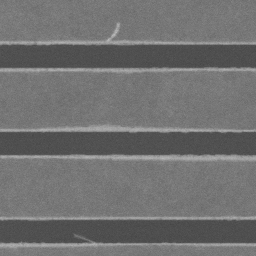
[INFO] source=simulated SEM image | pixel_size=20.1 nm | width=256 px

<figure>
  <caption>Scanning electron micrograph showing lines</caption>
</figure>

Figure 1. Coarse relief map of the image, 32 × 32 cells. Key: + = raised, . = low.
++++++++++++++++++++++++++++++++
++++++++++++++++++++++++++++++++
++++++++++++++++++++++++++++++++
++++++++++++++++++++++++++++++++
++++++++++++++++++++++++++++++++
.......................++.++++++
................................
................................
................................
++++++++++++++++++++++++++++++++
++++++++++++++++++++++++++++++++
++++++++++++++++++++++++++++++++
++++++++++++++++++++++++++++++++
++++++++++++++++++++++++++++++++
++++++++++++++++++++++++++++++++
++++++++++++++++++++++++++++++++
................................
................................
................................
++++++++........................
++++++++++++++++++++++++++++++++
++++++++++++++++++++++++++++++++
++++++++++++++++++++++++++++++++
++++++++++++++++++++++++++++++++
++++++++++++++++++++++++++++++++
++++++++++++++++++++++++++++++++
++++++++++++++++++++++++++++++++
................................
................................
................................
++++++++++++++++++++++++++++++++
++++++++++++++++++++++++++++++++